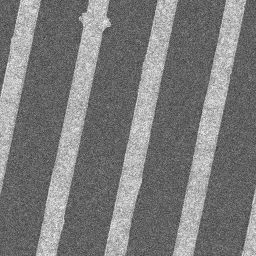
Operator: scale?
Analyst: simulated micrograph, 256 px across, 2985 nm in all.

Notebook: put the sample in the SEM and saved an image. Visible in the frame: one or a few lines or trenches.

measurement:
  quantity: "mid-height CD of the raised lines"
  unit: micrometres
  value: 0.227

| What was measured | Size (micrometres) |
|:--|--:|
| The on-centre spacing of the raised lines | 0.782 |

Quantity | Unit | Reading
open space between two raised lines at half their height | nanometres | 555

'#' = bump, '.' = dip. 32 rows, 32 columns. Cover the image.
...##......###......##......###.
..###......##......###......##..
..###.....####.....###......##..
..##......###......##.......##..
..##......###......##......###..
.###......###......##......###..
.###......##......###......##...
.##.......##......###......##...
.##......###......##.......##...
.##......###......##......###...
###......##......###......###...
###......##......###......##....
##.......##......###......##....
##......###......##......###....
##......###......##......###....
##......##.......##......###....
##......##......###......##.....
#.......##......###......##.....
#......###......##......###.....
#......###......##......###.....
#......##......###......###.....
#......##......###......##......
......###......###......##......
......###......##......###......
......###......##......###......
......##......###......##.......
......##......###......##......#
.....###......##.......##......#
.....###......##......###......#
.....##.......##......###......#
.....##......###......##.......#
.....##......###......##......##